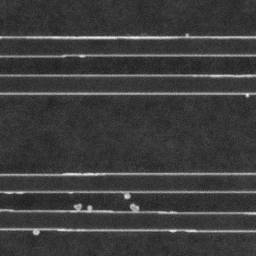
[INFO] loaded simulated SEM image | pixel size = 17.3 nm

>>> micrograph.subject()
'lines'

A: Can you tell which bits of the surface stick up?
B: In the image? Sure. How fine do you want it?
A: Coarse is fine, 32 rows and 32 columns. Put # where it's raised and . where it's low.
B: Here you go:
................................
................................
................................
................................
................................
################################
################################
................................
................................
################################
################################
################################
................................
................................
................................
................................
................................
................................
................................
................................
................................
................................
################################
################################
................................
................................
##############..#...............
################################
################################
................................
................................
................................